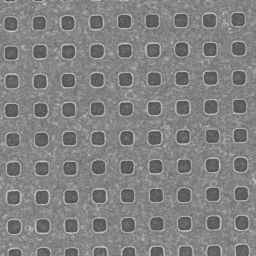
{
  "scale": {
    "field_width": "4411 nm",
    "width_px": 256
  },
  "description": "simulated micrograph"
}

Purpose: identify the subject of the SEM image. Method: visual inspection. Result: a regular array of holes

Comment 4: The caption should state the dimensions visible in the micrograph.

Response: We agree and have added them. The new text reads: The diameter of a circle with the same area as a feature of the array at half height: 256 nanometers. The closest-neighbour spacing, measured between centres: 28.3 px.